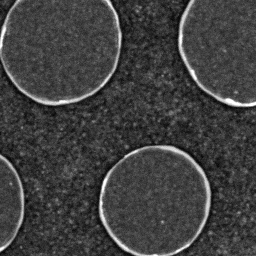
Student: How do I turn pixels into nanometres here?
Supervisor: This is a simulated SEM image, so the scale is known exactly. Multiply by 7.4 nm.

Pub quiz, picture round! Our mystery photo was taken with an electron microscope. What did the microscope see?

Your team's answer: raised bodies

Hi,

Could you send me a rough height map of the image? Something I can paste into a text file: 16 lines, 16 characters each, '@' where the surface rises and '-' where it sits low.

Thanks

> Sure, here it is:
-@@@@@@-----@@@@
@@@@@@@----@@@@@
@@@@@@@@---@@@@@
@@@@@@@----@@@@@
@@@@@@@-----@@@@
-@@@@@-------@@@
--------------@@
----------------
----------------
--------@@@-----
@------@@@@@----
@-----@@@@@@@---
@-----@@@@@@@---
@-----@@@@@@@---
@------@@@@@----
--------@@@@----